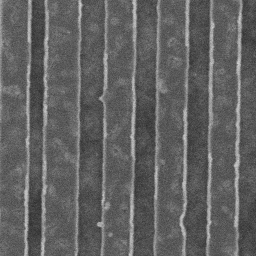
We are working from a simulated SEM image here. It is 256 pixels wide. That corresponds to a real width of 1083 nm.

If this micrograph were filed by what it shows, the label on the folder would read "parallel lines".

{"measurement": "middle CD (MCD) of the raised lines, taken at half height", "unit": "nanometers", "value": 130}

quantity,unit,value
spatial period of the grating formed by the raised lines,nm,230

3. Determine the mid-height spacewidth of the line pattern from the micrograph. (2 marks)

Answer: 92.5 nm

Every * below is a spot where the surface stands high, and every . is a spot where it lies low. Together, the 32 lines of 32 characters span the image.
****..****...****...****..****..
****..****...****...****..****..
****..****...****...****..****..
****..****...****...****..****..
****..****...****...****..****..
****..****...****...****..****..
****..****...****...****..****..
****..****...****...****..****..
****..****...****...****..****..
****..****...****...***...****..
****..****...****...***...****..
****..****...****...***...****..
****..****...****...***...****..
****.*****...****...***...****..
****.*****...****...***...****..
****.*****...****..****...****..
****.*****...****...***...****..
****.*****...****...***...****..
****.*****...****...***...****..
****.*****...****...***...****..
****.*****...****...***...****..
****.*****...****..****...****..
***..*****...****..****...****..
***..*****...****..****...****..
***..*****...****..****...****..
***..*****...****..****...****..
***..*****...****..****...****..
***..*****...****..****...****..
***..*****...****..****...****..
***..*****...****..****...****..
***..*****...****..****...****..
***..*****...****..****...****..